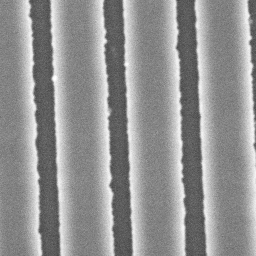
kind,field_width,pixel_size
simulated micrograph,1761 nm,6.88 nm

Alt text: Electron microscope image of lines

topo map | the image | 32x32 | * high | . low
****..*******...******..*******.
****..*******...******..*******.
****..*******...******...******.
****..*******...******...******.
****...******...******...******.
****...******...******...******.
****...******...******...******.
****...******...******...******.
****...******...******...******.
****...******...******...******.
****...******...******...******.
****...******...******...******.
****...******...******...*******
****...******...*******..******.
****...******...*******..*******
****...******...*******..*******
*****..*******..*******..*******
****...*******..*******..*******
****...*******..*******..*******
*****..*******..*******..*******
*****..*******..*******..*******
*****..*******..*******..*******
*****..*******..*******..*******
*****..*******..*******...******
*****..*******..*******...******
*****...******..*******...******
*****...******..*******...******
*****...******..*******...******
*****...******...******...******
*****...******...******...******
*****...******...******...******
*****...******...******...******